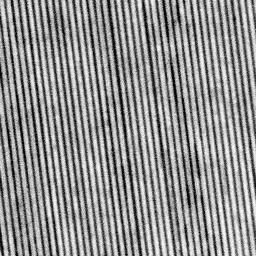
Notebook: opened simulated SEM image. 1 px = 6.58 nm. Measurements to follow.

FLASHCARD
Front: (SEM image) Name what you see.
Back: parallel lines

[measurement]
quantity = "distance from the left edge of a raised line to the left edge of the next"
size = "44.9 nm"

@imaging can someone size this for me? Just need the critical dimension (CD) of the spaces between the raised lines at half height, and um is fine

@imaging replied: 0.0261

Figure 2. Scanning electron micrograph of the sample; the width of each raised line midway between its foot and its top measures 19.6 nm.